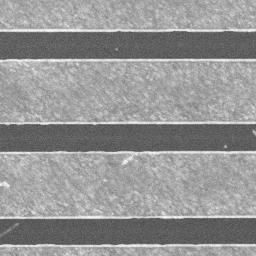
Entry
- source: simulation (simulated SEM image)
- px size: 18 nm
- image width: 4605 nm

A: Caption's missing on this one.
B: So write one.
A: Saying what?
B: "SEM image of lines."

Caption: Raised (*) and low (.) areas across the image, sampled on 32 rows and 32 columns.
********************************
********************************
********************************
********************************
................................
................................
................................
.....**.************************
********************************
********************************
********************************
********************************
********************************
********************************
********************************
................................
................................
................................
................................
********************************
********************************
********************************
********************************
********************************
********************************
********************************
********************************
................................
................................
................................
................................
********************************